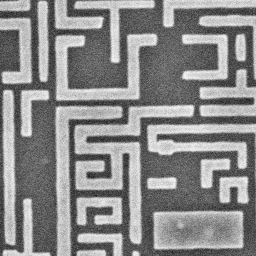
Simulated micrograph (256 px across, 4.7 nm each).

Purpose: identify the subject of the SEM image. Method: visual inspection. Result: wiring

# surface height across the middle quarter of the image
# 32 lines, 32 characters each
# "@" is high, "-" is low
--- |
----------------@@@-------------
----------------@@@-------------
----------------@@@-----------@@
@---------------@@@-----------@@
@---------------@@@-------------
@---------------@@@-------------
@-----@@@@@@@@@@@@@-------------
@@@@@@@@@@@@@@@@@@@-------------
@@@@@@@@@@@@@@@@@@@-------------
--------------------------------
--------------------------------
@@@@@@@@@@@@@@--@@@@@@@@@@@@@@@@
@@@@@@@@@@@@@@--@@@@@@@@@@@@@@@@
@@@@@@@@@@@@@---@@@-------------
@---------------@@@-------------
@------@@@-@@@@@@@@-----@@@-----
@--@@@@@@@@@@@@@@@@--@@@@@@@@@@@
@--@@@@@@@@@@@@@@@@--@@@--------
@--@@----------------@@---------
@--@@----------------@@@@@@@----
@--@@@@@@@@@@@@@@@@--@@@@@@@@@@@
@--@@@@@@@@@@@@@@@@---@@@@@@@--@
@-----------@@@-@@@-------------
@-----------@@---@@-------------
@--@@@@@@@--@@---@@-------------
@--@@@@@@@--@@---@@-------------
@--@@@@@@@--@@--@@@-------------
@--@@-------@@--@@@-------------
@--@@@------@@---@@-------------
@--@@@@@@@@@@@---@@--@@@@@@@----
@--@@@@@@@@@@@---@@--@@@@@@@----
@----------------@@-------------